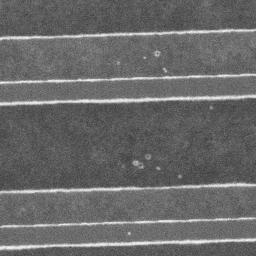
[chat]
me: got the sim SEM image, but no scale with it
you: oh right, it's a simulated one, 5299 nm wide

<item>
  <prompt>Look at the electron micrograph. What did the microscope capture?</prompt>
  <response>lines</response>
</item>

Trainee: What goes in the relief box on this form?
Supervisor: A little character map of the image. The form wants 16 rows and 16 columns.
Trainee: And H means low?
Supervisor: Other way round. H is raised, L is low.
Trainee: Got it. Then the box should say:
LLLLLLLLLLLLLLLL
LLLLLLLLLLLLLLLL
HHHHHHHHHHHHHHHH
HHHHHHHHHHHHHHHH
HHHHHHHHHHHHHHHH
HHHHHHHHHHHHHHHH
LLLLLLLLLLLLLLLL
LLLLLLLLLLLLLLLL
LLLLLLLLLLLLLLLL
LLLLLLLLLLLLLLLL
LLLLLLLLLLLLLLLL
LLLLLLLLLLLLLLLL
HHHHHHHHHHHHHHHH
HHHHHHHHHHHHHHHH
HHHHHHHHHHHHHHHH
LLLLLLLLLLLLLLLL